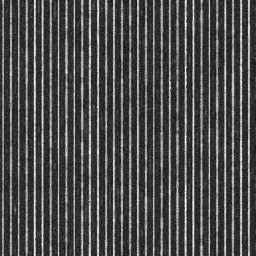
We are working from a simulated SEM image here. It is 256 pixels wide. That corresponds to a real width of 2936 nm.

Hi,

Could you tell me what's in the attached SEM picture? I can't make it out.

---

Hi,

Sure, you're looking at parallel lines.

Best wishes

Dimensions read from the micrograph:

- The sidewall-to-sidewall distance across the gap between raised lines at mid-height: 76 nanometers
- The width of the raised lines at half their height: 18.6 nanometres